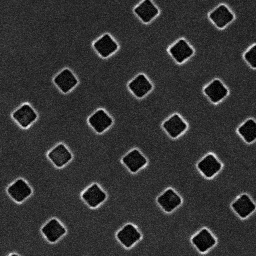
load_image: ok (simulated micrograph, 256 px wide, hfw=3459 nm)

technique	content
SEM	a regular array of holes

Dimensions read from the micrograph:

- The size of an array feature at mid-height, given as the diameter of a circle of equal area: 286 nm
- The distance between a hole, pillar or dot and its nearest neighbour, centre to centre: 715 nm